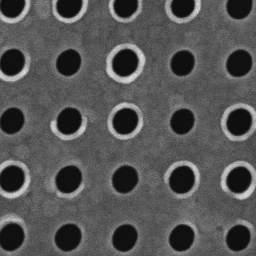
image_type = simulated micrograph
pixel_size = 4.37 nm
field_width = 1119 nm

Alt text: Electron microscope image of a regular array of holes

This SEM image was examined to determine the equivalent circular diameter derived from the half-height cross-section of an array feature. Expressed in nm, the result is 114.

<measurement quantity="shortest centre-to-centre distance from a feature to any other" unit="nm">248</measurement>